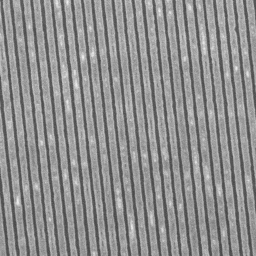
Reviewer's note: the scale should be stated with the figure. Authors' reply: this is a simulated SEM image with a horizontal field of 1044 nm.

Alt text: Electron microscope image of parallel lines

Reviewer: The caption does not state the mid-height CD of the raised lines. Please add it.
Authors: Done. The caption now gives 0.0253 micrometres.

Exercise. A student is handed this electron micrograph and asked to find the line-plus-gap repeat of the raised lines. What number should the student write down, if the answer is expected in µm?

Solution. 0.0412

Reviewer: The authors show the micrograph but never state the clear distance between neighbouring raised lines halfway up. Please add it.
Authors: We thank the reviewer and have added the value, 14.2 nanometers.